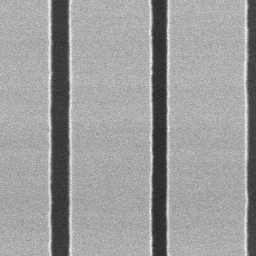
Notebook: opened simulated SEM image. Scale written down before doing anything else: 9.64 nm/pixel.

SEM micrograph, lines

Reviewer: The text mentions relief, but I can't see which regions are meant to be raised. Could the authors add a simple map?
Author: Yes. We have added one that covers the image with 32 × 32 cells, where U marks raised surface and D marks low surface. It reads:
UUUUUUDDDUUUUUUUUUUDDUUUUUUUUUUD
UUUUUUDDDUUUUUUUUUUDDUUUUUUUUUUD
UUUUUUDDDUUUUUUUUUUDDUUUUUUUUUUD
UUUUUUDDDUUUUUUUUUUDDUUUUUUUUUUD
UUUUUUDDDUUUUUUUUUUDDUUUUUUUUUUD
UUUUUUDDDUUUUUUUUUUDDUUUUUUUUUUD
UUUUUUDDDUUUUUUUUUUDDUUUUUUUUUUD
UUUUUUDDDUUUUUUUUUUDDUUUUUUUUUUD
UUUUUUDDDUUUUUUUUUUDDUUUUUUUUUUD
UUUUUUDDDUUUUUUUUUUDDUUUUUUUUUUD
UUUUUUDDDUUUUUUUUUUDDUUUUUUUUUUD
UUUUUUDDDUUUUUUUUUUDDUUUUUUUUUUD
UUUUUUDDDUUUUUUUUUUDDUUUUUUUUUUD
UUUUUUDDDUUUUUUUUUUDDUUUUUUUUUUD
UUUUUUDDDUUUUUUUUUUDDUUUUUUUUUUD
UUUUUUDDDUUUUUUUUUUDDUUUUUUUUUUD
UUUUUUDDDUUUUUUUUUUDDUUUUUUUUUUD
UUUUUUDDDUUUUUUUUUUDDUUUUUUUUUUD
UUUUUUDDDUUUUUUUUUUDDUUUUUUUUUUD
UUUUUUDDDUUUUUUUUUUDDUUUUUUUUUUD
UUUUUUDDDUUUUUUUUUUDDUUUUUUUUUUD
UUUUUUDDDUUUUUUUUUUDDUUUUUUUUUUD
UUUUUUDDDUUUUUUUUUUDDUUUUUUUUUUD
UUUUUUDDDUUUUUUUUUUDDUUUUUUUUUUD
UUUUUUDDDUUUUUUUUUUDDUUUUUUUUUUD
UUUUUUDDDUUUUUUUUUUDDUUUUUUUUUUD
UUUUUUDDDUUUUUUUUUUDDUUUUUUUUUUD
UUUUUUDDDUUUUUUUUUUDDUUUUUUUUUUD
UUUUUUDDDUUUUUUUUUUDDUUUUUUUUUUD
UUUUUUDDDUUUUUUUUUUDDUUUUUUUUUUD
UUUUUUDDDUUUUUUUUUUDDUUUUUUUUUUD
UUUUUUDDDUUUUUUUUUUDDUUUUUUUUUUD